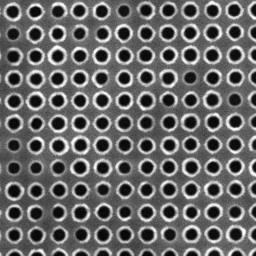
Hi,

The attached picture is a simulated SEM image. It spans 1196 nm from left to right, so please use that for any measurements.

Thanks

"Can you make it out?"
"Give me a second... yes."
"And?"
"a regular array of holes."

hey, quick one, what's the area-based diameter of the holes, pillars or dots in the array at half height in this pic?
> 57.5 nm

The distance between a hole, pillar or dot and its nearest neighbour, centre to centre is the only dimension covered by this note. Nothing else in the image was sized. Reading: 21.8 pixels